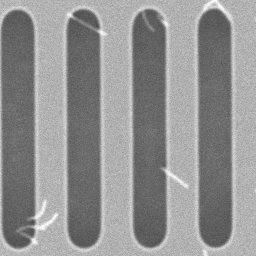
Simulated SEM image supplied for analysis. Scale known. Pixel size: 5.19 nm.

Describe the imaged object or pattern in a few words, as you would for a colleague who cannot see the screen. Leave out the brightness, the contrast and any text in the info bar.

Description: groups of lines, slits or small figures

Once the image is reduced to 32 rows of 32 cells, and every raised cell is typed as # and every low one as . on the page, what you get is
################################
#..######...#####...######..####
....#####...#####...#####....###
....####....#####....####....###
....####.....###.....####....###
....####.....###.....####....###
....####.....###.....####....###
....####.....###.....####....###
....####.....###.....####....###
....####.....###.....####....###
....####.....###.....####....###
....####.....###.....####....###
....####.....###.....####....###
....####.....###.....####....###
....####.....###.....####....###
....####.....###.....####....###
....####.....###.....####....###
....####.....###.....####....###
....####.....###.....####....###
....####.....###.....####....###
....####.....###.....####....###
....####.....###.....####....###
....####.....###.....####....###
....####.....####....####....###
....####.....####....####....###
....####.....####....####....###
....####.....####....####....###
....####.....####....####....###
....####.....####....####....###
....#####....####....####....###
#...#####...#####...######..####
################################